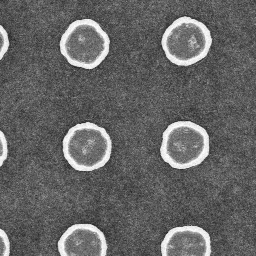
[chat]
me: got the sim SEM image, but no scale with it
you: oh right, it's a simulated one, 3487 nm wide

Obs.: raised bodies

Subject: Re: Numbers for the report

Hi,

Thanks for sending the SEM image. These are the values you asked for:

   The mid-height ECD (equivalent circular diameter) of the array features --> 599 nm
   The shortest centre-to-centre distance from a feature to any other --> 1350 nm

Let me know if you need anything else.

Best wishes